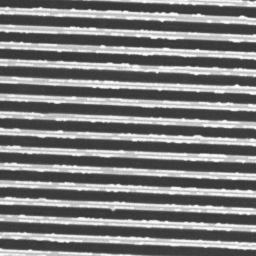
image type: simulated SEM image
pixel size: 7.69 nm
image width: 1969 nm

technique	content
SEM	parallel lines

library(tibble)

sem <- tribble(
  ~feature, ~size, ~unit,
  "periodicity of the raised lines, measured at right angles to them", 133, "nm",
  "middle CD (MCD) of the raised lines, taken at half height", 7.62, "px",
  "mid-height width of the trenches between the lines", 73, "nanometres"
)